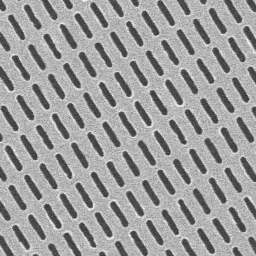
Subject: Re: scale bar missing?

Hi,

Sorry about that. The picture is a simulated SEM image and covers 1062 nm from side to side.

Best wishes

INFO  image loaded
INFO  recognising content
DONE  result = a regular array of holes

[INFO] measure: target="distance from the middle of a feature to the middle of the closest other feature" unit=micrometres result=0.0779